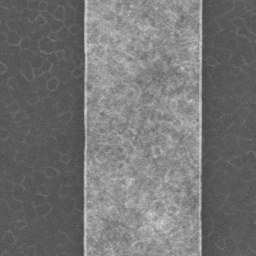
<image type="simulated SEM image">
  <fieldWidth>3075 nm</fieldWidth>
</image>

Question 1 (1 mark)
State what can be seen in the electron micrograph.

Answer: one or a few lines or trenches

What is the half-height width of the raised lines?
1370 nanometers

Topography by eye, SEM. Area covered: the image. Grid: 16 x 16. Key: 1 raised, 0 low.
0000011111111000
0000011111111000
0000011111111000
0000011111110000
0000011111111000
0000011111111000
0000011111111000
0000011111111000
0000011111111000
0000011111111000
0000011111110000
0000011111110000
0000011111110000
0000011111110000
0000011111111000
0000011111111000